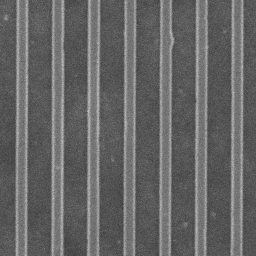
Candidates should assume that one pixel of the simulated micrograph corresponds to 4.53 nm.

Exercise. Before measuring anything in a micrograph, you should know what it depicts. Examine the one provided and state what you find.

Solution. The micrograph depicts parallel lines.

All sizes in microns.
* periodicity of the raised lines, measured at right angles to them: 0.162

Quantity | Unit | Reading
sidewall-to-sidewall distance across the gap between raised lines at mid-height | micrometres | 0.117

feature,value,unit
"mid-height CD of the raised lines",44.7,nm